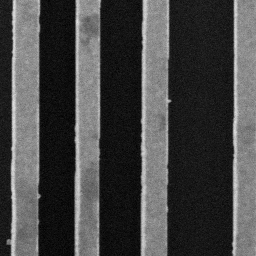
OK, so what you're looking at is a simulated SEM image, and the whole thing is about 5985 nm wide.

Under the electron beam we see lines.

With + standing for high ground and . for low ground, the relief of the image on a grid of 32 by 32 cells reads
..+++.....+++.....+++........+++
..+++.....++......+++........+++
..+++.....++......+++........+++
..+++.....++......+++........+++
..+++.....++......+++........+++
..+++.....++......+++........+++
..+++.....++......+++........+++
..+++.....++......+++........+++
..+++.....++......+++........+++
..+++.....++......+++........+++
..+++.....++......+++........+++
..+++.....++......+++........+++
..+++.....++......+++........+++
..+++.....++......+++........+++
..+++.....++......+++........+++
..+++.....++......+++........+++
..+++.....++......+++........+++
..+++.....++......+++........+++
..+++.....++......+++........+++
..+++.....++......+++........+++
..+++.....++......+++........+++
..+++.....++......+++........+++
..+++.....++......+++........+++
..+++.....++......+++........+++
..+++.....++......+++........+++
..+++.....++......+++........+++
..+++.....++......+++........+++
..+++.....++......+++........+++
..+++....+++......+++........+++
..+++.....++......+++........+++
..+++....+++......+++........+++
..+++....+++......+++........+++